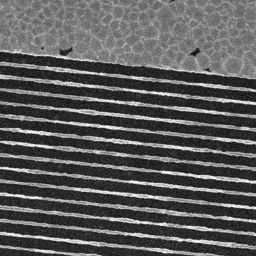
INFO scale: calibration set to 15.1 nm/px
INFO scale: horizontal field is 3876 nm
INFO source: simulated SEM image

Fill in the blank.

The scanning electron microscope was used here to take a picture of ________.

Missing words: parallel lines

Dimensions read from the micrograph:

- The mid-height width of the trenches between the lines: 0.16 µm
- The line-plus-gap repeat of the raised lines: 13 px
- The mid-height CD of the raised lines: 37.7 nanometres